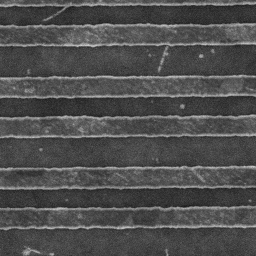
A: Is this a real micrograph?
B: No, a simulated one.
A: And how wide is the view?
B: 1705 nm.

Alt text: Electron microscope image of lines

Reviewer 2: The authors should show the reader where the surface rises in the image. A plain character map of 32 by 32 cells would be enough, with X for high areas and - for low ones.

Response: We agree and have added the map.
XXXXXXXXXXXXXXXXXXXXXXXXXXXXXXXX
--------------------------------
--------------------------------
XXXXXXXXXXXXXXXXXXXXXXXXXXXXXXXX
XXXXXXXXXXXXXXXXXXXXXXXXXXXXXXXX
XXXXXXXXXXXXXXXXXXXXXXXXXXXXXX--
--------------------------------
--------------------------------
--------------------------------
------------------------------X-
XXXXXXXXXXXXXXXXXXXXXXXXXXXXXXXX
XXXXXXXXXXXXXXXXXXXXXXXXXXXXXXXX
--------------------------------
--------------------------------
--------X-X--------X-X--XXXXX-XX
XXXXXXXXXXXXXXXXXXXXXXXXXXXXXXXX
XXXXXXXXXXXXXXXXXXXXXXXXXXXXXXXX
--------------------------------
--------------------------------
--------------------------------
--------------------------------
XXXXXXXXXXXXXXXXXXXXXXXXXXXXXXXX
XXXXXXXXXXXXXXXXXXXXXXXXXXXXXXXX
XXXXXXX----X---X----------------
--------------------------------
--------------------------------
XXXXXXXXXXXXXXXXXXXXXXXXXXXXXXXX
XXXXXXXXXXXXXXXXXXXXXXXXXXXXXXXX
XXXX--X--X----XX----------------
--------------------------------
--------------------------------
--------------------------------